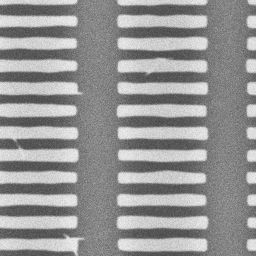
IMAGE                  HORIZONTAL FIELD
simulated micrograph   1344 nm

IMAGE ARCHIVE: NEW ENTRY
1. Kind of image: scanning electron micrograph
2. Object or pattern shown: groups of lines, slits or small figures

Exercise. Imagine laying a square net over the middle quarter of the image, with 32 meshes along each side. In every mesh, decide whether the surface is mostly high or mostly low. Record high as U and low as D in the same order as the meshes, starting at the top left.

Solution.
UUUDDDDDDDDDDDUUUUUUUUUUUUUUUUUU
UDDDDDDDDDDDDDUUUUUUUUUUUUUUUUUU
DDDDDDDDDDDDDDDDDDDDDDDDDDDDDDDD
DDDDDDDDDDDDDDDDDDDDDDDDDDDDDDDD
DDDDDDDDDDDDDDDDDDDDDDDDDDDDDDDD
UUUDDDDDDDDDDDUUUUUUUUUUUUUUUUUU
UUUDDDDDDDDDDDUUUUUUUUUUUUUUUUUU
DDDDDDDDDDDDDDDDDDDDDDDDDDDDDDDD
DDDDDDDDDDDDDDDDDDDDDDDDDDDDDDDD
DDDDDDDDDDDDDDDDDDDDDDDDDDDDDDDD
UUDDDDDDDDDDDDUUUUUUUUUUUUUUUUUU
UUUDDDDDDDDDDUUUUUUUUUUUUUUUUUUU
UUUDDDDDDDDDDUUUUUUUUUUUUUUUUUUU
DDDDDDDDDDDDDDDDDDDDDDDDDDDDDDDD
DDDDDDDDDDDDDDDDDDDDDDDDDDDDDDDD
DDDDDDDDDDDDDDDDDDDDDDDDDDDDDDDD
UUUDDDDDDDDDDDUUUUUUUUUUUUUUUUUU
UUUDDDDDDDDDDDUUUUUUUUUUUUUUUUUU
UUUDDDDDDDDDDDUUDDDDDDUUUUUDDDUU
DDDDDDDDDDDDDDDDDDDDDDDDDDDDDDDD
DDDDDDDDDDDDDDDDDDDDDDDDDDDDDDDD
UUUDDDDDDDDDDDDDUUUUUUUUUDDDDDDD
UUUDDDDDDDDDDDUUUUUUUUUUUUUUUUUU
UUUDDDDDDDDDDDUUUUUUUUUUUUUUUUUU
DDDDDDDDDDDDDDDDDDDDDDDDDDDDDDDD
DDDDDDDDDDDDDDDDDDDDDDDDDDDDDDDD
DDDDDDDDDDDDDDDDDDDDDDDDDDDDDDDD
UUUDDDDDDDDDDDUUUUUUUUUUUUUUUUUU
UUUDDDDDDDDDDDUUUUUUUUUUUUUUUUUU
UUUDDDDDDDDDDDUUUUUUUUUUUUUUUUUU
DDDDDDDDDDDDDDDDDDDDDDDDDDDDDDDD
DDDDDDDDDDDDDDDDDDDDDDDDDDDDDDDD